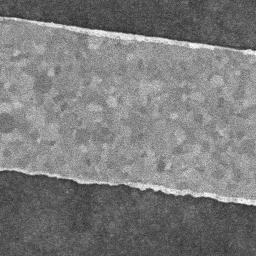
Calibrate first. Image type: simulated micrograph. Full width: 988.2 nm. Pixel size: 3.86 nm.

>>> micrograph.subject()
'one or a few lines or trenches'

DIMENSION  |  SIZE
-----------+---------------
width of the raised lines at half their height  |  581 nm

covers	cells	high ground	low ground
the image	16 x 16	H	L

LLLLLLLLLLLLLLLL
HHHLLLLLLLLLLLLL
HHHHHHHHHHHLLLLL
HHHHHHHHHHHHHHHH
HHHHHHHHHHHHHHHH
HHHHHHHHHHHHHHHH
HHHHHHHHHHHHHHHH
HHHHHHHHHHHHHHHH
HHHHHHHHHHHHHHHH
HHHHHHHHHHHHHHHH
HHHHHHHHHHHHHHHH
LLLLLLLHHHHHHHHH
LLLLLLLLLLLLLLHH
LLLLLLLLLLLLLLLL
LLLLLLLLLLLLLLLL
LLLLLLLLLLLLLLLL